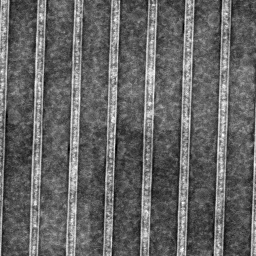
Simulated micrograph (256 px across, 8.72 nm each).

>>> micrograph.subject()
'parallel lines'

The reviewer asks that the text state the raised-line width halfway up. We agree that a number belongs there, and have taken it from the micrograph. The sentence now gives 8.5 px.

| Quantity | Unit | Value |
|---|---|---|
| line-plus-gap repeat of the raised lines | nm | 322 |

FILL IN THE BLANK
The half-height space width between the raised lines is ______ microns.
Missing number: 0.247